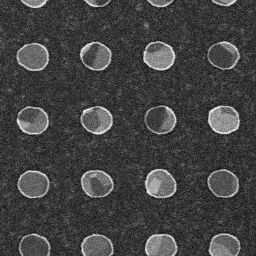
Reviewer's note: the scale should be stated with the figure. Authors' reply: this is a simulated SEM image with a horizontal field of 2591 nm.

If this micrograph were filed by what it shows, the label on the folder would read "a regular array of raised bodies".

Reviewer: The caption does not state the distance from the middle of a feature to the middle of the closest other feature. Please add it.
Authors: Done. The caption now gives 643 nm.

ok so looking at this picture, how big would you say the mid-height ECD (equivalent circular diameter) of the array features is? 292 nanometres